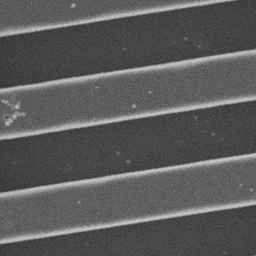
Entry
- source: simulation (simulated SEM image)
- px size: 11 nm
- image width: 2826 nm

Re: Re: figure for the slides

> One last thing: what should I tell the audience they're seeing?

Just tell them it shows lines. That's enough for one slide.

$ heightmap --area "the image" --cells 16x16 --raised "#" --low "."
###########.....
#####...........
................
.............###
.......#########
################
##############..
########........
##..............
................
..........######
....############
################
###########.....
#####...........
................